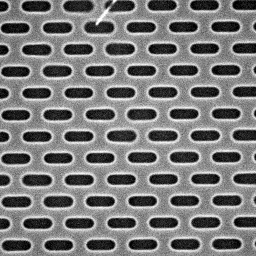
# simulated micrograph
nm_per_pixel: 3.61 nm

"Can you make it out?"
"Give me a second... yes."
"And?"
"groups of lines, slits or small figures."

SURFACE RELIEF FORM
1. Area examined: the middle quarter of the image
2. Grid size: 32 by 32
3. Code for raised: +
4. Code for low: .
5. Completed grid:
.+++++......++++......+++++.....
..+++........+++.......+++......
..+++.......++++.......+++......
++++++++++++++++++++++++++++++++
++++++++++++++++++++++++++++++++
++++++++++++++++++++++++++++++++
.......++++.......+++.......++++
.......++++.......+++.......++++
+.....++++++.....+++++.....+++++
++++++++++++++++++++++++++++++++
++++++++++++++++++++++++++++++++
.+++++......++++.......++++.....
..+++........+++.......+++......
..++++.......+++.......++++.....
++++++++++++++++++++++++++++++++
++++++++++++++++++++++++++++++++
++++++++++++.....+++++.....+++++
.......++++.......+++.......++++
.......++++.......+++.......++++
+.....++++++.....+++++.....+++++
++++++++++++++++++++++++++++++++
++++++++++++++++++++++++++++++++
..++++......++++.......+++......
..+++........+++.......+++......
..++++......++++.......++++.....
++++++++++++++++++++++++++++++++
++++++++++++++++++++++++++++++++
+.....++++++.....+++++......++++
.......++++.......+++.......++++
.......++++.......+++.......++++
++....++++++++++++++++++++++++++
++++++++++++++++++++++++++++++++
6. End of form